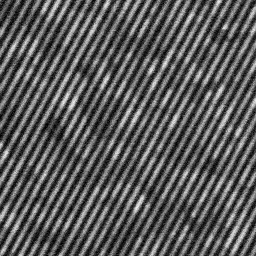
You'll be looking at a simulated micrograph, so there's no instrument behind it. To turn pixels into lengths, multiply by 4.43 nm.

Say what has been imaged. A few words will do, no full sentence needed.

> parallel lines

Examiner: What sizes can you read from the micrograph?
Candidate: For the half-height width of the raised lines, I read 2.73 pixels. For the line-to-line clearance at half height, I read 0.0277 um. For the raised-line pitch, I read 39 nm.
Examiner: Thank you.